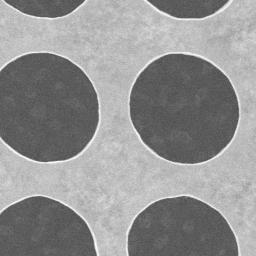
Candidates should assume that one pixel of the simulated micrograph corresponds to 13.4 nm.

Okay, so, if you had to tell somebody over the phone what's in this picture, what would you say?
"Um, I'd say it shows holes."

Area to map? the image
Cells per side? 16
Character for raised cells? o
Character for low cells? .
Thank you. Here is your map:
o....ooooo....oo
oooooooooooooooo
oooooooooooooooo
o...oooooo..oooo
.....oooo.....oo
......oo.......o
......oo.......o
......oo.......o
......ooo......o
o....ooooo....oo
oooooooooooooooo
oooooooooooooooo
o..ooooooo..oooo
.....oooo.....oo
......oo.......o
......oo.......o